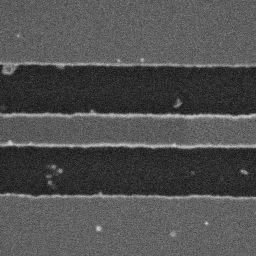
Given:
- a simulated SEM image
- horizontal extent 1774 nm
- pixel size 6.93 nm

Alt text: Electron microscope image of lines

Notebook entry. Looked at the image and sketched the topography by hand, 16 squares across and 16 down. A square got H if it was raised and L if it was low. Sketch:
HHHHHHHHHHHHHHHH
HHHHHHHHHHHHHHHH
HHHHHHHHHHHHHHHH
HHHHHHHHHHHHHHHH
LLLLLLLLLLLLLLLL
LLLLLLLLLLLLLLLL
LLLLLLLLLLLLLLLL
HHHHHHHHHHHHHHHH
HHHHHHHHHHHHHHHH
LLLLLLLLLLLLLLLL
LLLLLLLLLLLLLLLL
LLLLLLLLLLLLLLLL
HHHHHHHHHHHHHHHH
HHHHHHHHHHHHHHHH
HHHHHHHHHHHHHHHH
HHHHHHHHHHHHHHHH